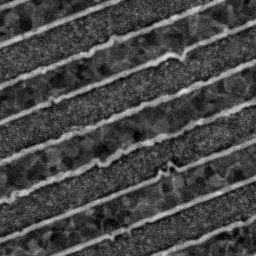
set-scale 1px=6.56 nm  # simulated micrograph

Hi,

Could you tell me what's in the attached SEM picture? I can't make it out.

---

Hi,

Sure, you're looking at one or a few lines or trenches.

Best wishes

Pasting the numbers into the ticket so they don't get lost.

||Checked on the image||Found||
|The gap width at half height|235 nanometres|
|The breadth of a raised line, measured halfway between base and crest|234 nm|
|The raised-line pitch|0.472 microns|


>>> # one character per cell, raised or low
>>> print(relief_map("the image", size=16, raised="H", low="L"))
HHHHHHLLLLLLLHHH
HHHHLLLLLLHHHHHH
HLLLLLLHHHHHHLLL
LLLLLHHHHHHLLLLL
LLHHHHHHLLLLLLHH
HHHHHHLLLLLLHHHH
HHHLLLLLLHHHHHHH
LLLLLLLHHHHHHLLL
LLLLHHHHHHHLLLLL
LHHHHHHHLLLLLLHH
HHHHHLLLLLLHHHHH
HHHLLLLLLHHHHHHL
HLLLLLHHHHHHLLLL
LLLLHHHHHHLLLLLL
LHHHHHHHLLLLLHHH
HHHHHLLLLLLHHHHH